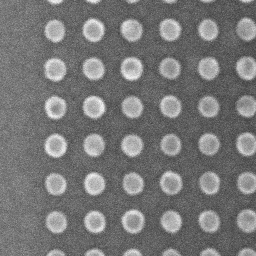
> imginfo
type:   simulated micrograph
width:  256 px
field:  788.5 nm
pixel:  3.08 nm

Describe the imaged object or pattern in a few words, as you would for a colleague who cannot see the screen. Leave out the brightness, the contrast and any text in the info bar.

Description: a regular array of raised bodies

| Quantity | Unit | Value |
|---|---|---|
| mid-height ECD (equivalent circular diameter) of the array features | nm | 61.2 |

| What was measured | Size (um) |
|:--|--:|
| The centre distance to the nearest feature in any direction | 0.117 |